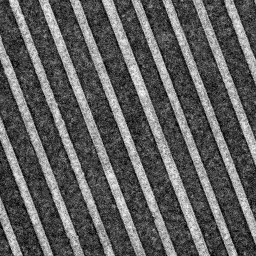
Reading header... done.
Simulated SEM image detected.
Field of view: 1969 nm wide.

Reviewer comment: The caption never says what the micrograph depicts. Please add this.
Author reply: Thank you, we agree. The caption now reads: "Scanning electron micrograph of parallel lines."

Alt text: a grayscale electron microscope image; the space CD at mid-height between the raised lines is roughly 163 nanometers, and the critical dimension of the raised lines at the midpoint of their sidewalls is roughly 59.3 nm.